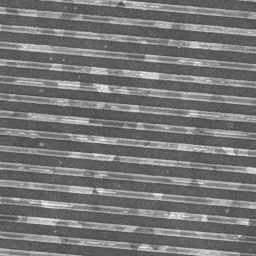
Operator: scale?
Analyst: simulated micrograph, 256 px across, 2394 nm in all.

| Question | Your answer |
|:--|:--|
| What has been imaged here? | parallel lines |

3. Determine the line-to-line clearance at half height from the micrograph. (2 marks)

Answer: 113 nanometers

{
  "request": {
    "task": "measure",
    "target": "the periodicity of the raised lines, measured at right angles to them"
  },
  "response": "161 nanometers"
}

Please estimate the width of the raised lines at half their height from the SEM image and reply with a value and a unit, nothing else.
0.0489 micrometres